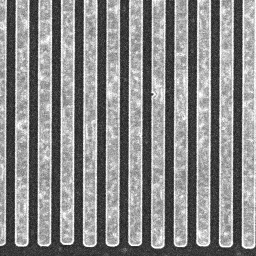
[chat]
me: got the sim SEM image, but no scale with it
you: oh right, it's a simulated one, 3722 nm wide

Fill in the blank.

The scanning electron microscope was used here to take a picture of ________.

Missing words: parallel lines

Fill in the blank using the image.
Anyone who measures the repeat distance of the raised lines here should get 330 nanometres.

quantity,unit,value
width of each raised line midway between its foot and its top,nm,171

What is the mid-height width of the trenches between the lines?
158 nm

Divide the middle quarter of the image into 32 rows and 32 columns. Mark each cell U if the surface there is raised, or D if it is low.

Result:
UUDDDUUUDDDUUUDDDUUDDDUUUDDDUUUD
UUDDDUUUDDDUUUDDDUUDDDUUUDDDUUUD
UUDDDUUUDDDUUUDDDUUDDDUUUDDDUUUD
UUDDDUUUDDDUUUDDDUUDDDUUUDDDUUUD
UUDDDUUUDDDUUUDDDUUDDDUUUDDDUUUD
UUDDDUUUDDDUUUDDDUUDDDUUUDDDUUUD
UUDDDUUUDDDUUUDDDUUDDDUUUDDDUUUD
UUDDDUUUDDDUUUDDDUUDDDUUUDDDUUUD
UUDDDUUUDDDUUUDDDUUDDDUUUDDDUUUD
UUDDDUUUDDDUUUDDDUUDDDUUUDDDUUUD
UUDDDUUUDDDUUUDDDUUDDDUUUDDDUUUD
UUDDDUUUDDDUUUDDDUUDDDUUUDDDUUUD
UUDDDUUUDDDUUUDDDUUDDDUUUDDDUUUD
UUDDDUUUDDDUUUDDDUUDDDUUUDDDUUUD
UUDDDUUUDDDUUUDDDUUDDDUUUDDDUUUD
UUDDDUUUDDDUUUDDDUUDDDUUUDDDUUUD
UUDDDUUUDDDUUUDDDUUDDDUUUDDDUUUD
UUDDDUUUDDDUUUDDDUUDDDUUUDDDUUUD
UUDDDUUUDDDUUUDDDUUDDDUUUDDDUUUD
UUDDDUUUDDDUUUDDDUUDDDUUUDDDUUUD
UUDDDUUUDDDUUUDDDUUDDDUUUDDDUUUD
UUDDDUUUDDDUUUDDDUUDDDUUUDDDUUUD
UUDDDUUUDDDUUUDDDUUDDDUUUDDDUUUD
UUDDDUUUDDDUUUDDDUUDDDUUUDDDUUUD
UUDDDUUUDDDUUUDDDUUDDDUUUDDDUUUD
UUDDDUUUDDDUUUDDDUUDDDUUUDDDUUUD
UUDDDUUUDDDUUUDDDUUDDDUUUDDDUUUD
UUDDDUUUDDDUUUDDUUUDDDUUUDDDUUUD
UUDDDUUUDDDUUUDDUUUDDDUUUDDDUUUD
UUDDDUUUDDDUUUDDUUUDDDUUUDDDUUUD
UUDDDUUUDDDUUUDDUUUDDDUUUDDDUUUD
UUDDDUUUDDDUUUDDUUUDDDUUUDDDUUUD